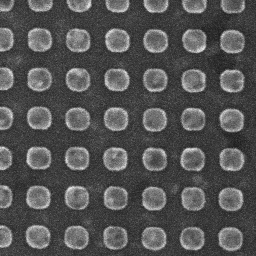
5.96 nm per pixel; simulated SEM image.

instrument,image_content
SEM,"a regular array of raised bodies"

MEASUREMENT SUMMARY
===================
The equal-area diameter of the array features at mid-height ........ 0.142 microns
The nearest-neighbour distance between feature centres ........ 229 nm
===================